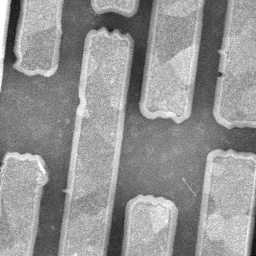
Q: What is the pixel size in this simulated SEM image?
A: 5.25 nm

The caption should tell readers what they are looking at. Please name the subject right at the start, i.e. one or a few lines or trenches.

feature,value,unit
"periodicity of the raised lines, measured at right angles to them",356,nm